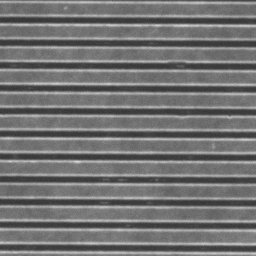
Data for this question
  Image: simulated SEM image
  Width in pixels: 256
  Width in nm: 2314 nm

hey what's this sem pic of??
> parallel lines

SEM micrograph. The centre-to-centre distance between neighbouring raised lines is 206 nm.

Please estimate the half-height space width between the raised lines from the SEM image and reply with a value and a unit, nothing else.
65.6 nanometers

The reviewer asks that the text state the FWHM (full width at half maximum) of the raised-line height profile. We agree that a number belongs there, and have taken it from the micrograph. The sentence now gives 139 nanometres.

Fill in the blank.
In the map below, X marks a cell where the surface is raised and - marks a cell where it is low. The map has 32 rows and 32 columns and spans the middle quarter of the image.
--------------------------------
--------------------------------
XXXXXXXXXXXXXXXXXXXXXXXXXXXXXXXX
XXXXXXXXXXXXXXXXXXXXXXXXXXXXXXXX
XXXXXXXXXXXXXXXXXXXXXXXXXXXXXXXX
--------------------------------
--------------------------------
XXXXXXXXXXXXXXXXXXXXXXXXXXXXXXXX
XXXXXXXXXXXXXXXXXXXXXXXXXXXXXXXX
XXXXXXXXXXXXXXXXXXXXXXXXXXXXXXXX
XXXXXXXXXXXXXXXXXXXXXXXXXXXXXXXX
--------------------------------
--------------------------------
XXXXXXXXXXXXXXXXXXXXXXXXXXXXXXXX
XXXXXXXXXXXXXXXXXXXXXXXXXXXXXXXX
XXXXXXXXXXXXXXXXXXXXXXXXXXXXXXXX
-----------XXXXXXXXXXXXXXXXXXXXX
--------------------------------
--------------------------------
XXXXXXXXXXXXXXXXXXXXXXXXXXXXXXXX
XXXXXXXXXXXXXXXXXXXXXXXXXXXXXXXX
XXXXXXXXXXXXXXXXXXXXXXXXXXXXXXXX
--------------------------------
--------------------------------
XXXXXXXXXXXXXXXXXXXXXXXXXXXXXXXX
XXXXXXXXXXXXXXXXXXXXXXXXXXXXXXXX
XXXXXXXXXXXXXXXXXXXXXXXXXXXXXXXX
XXXXXXXXXXXXXXXXXXXXXXXXXXXXXXXX
--------------------------------
--------------------------------
XXXXXXXXXXXXXXXXXXXXXXXXXXXXXXXX
XXXXXXXXXXXXXXXXXXXXXXXXXXXXXXXX